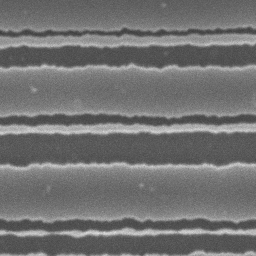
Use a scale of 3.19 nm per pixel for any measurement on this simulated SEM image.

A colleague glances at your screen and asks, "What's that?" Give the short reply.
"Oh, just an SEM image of lines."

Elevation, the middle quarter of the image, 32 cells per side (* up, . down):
......*.........**..............
********************************
********************************
********************************
********************************
********************************
********************************
********************************
********************************
********************************
********************************
********************************
***...........******************
................................
................................
.********************......*****
********************************
................................
................................
................................
................................
................................
................................
................................
................................
****************...**.....*..*..
********************************
********************************
********************************
********************************
********************************
********************************